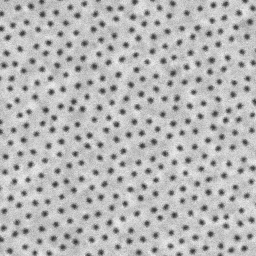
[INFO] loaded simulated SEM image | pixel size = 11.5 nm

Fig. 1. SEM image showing a regular array of holes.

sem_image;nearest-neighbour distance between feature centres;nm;144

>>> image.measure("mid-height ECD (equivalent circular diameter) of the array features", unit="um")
0.0769